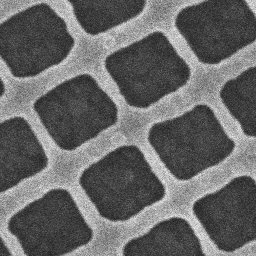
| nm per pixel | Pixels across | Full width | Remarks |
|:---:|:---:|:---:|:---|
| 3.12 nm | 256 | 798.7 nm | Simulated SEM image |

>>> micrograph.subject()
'holes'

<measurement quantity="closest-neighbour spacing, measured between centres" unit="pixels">81.5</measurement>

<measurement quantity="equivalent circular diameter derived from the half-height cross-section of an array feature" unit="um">0.229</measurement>